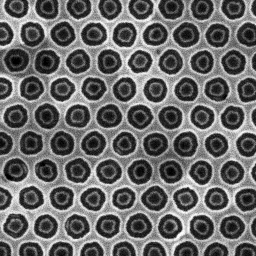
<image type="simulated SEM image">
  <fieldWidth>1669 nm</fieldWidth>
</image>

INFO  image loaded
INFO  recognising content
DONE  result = a regular array of ring-shaped grooves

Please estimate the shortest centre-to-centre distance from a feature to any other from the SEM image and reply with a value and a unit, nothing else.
199 nm